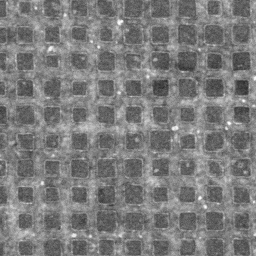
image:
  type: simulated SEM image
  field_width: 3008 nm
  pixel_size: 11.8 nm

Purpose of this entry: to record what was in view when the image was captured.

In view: a regular array of raised bodies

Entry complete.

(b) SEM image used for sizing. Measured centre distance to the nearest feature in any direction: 309 nm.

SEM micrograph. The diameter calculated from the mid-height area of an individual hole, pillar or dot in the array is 217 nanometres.